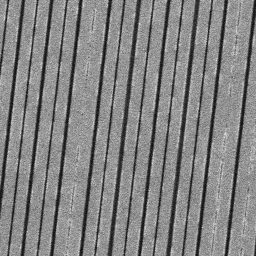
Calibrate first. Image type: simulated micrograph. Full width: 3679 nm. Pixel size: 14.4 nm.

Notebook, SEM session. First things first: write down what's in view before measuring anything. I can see parallel lines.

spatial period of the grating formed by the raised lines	207	nm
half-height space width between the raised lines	53.5	nanometres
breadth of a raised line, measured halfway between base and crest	162	nm